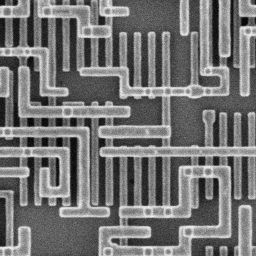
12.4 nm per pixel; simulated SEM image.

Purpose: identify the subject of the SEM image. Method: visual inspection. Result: wiring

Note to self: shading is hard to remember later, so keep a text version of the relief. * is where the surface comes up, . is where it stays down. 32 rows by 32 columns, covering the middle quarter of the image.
................................
....************................
....************................
..............**................
..............**................
..............**...............*
*.............******************
*.............******************
................................
................................
................................
****************................
****************................
................................
................................
................................
******...*****************......
******...*****************......
...***......***.................
....**..........................
....**..........................
*...**...***********************
*...**...***********************
*...**..........................
*...**..........................
*...**..........................
*...**.......................***
*...**.......................***
*...**.......................***
*...**.......................**.
*...**.......................***
*...**.......................***